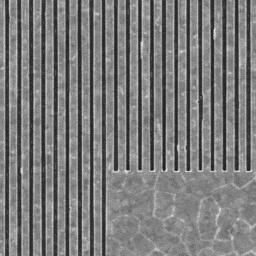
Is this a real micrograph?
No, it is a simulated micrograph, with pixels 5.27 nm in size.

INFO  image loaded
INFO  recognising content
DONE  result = parallel lines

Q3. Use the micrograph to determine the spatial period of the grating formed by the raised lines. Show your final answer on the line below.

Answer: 63.7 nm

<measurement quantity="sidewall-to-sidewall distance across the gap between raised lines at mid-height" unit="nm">23.1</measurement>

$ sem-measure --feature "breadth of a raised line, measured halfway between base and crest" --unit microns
0.0409